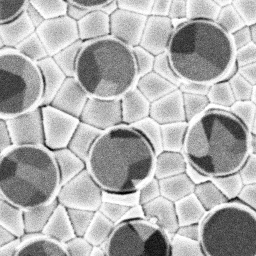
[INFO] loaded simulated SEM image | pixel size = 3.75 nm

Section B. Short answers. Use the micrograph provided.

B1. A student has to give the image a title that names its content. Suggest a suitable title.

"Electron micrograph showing raised bodies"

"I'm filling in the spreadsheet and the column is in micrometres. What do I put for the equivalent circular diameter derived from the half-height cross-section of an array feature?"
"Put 0.238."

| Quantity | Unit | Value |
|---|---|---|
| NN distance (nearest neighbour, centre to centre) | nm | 350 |